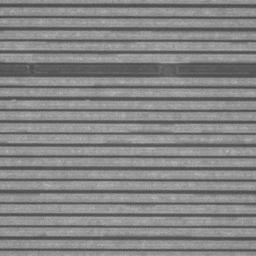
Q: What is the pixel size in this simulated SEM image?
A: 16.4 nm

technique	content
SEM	parallel lines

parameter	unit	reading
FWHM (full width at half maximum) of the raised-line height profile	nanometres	119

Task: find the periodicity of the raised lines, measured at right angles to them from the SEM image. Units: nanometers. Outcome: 191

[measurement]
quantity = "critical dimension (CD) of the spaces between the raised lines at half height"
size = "59.4 nm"